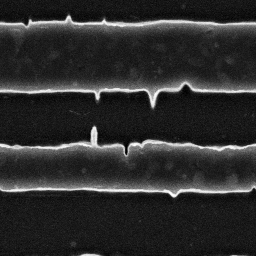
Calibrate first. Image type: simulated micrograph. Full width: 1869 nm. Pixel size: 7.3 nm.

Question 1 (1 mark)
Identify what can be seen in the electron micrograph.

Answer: one or a few lines or trenches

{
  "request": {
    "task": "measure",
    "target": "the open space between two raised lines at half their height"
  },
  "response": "0.397 micrometres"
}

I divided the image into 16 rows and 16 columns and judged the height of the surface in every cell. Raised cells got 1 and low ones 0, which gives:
0000000000000000
0011111001111100
1111111111111111
1111111111111111
1111111111111111
1111111111101111
0000000000000000
0000000000000000
0000000000000000
1111111111111111
1111111111111111
1111111111111111
0000000000000000
0000000000000000
0000000000000000
0000000000000000